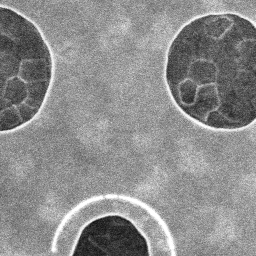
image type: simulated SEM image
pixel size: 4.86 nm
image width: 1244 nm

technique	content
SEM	holes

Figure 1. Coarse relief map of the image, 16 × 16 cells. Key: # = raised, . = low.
################
..##########....
...########.....
...#######......
...#######......
...########.....
...########.....
..##########....
################
################
################
################
################
################
#####....#######
#####....#######